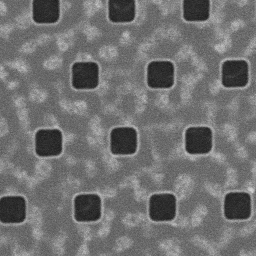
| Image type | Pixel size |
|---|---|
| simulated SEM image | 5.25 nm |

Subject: a regular array of holes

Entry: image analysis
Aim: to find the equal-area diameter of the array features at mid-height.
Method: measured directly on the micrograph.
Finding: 160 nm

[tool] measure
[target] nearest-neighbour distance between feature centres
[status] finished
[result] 394 nm